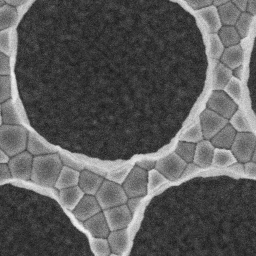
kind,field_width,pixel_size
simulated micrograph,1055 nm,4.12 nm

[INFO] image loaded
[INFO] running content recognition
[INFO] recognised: holes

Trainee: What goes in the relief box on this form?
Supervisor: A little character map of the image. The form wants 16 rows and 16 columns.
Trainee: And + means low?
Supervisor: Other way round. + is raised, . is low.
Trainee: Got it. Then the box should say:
++.........+++++
+...........++++
+............+++
+............+++
+............++.
+............++.
+...........++++
++..........++++
+++........+++++
++++......++++++
++++++++++++++++
+++++++++++.....
...++++++.......
....+++++.......
.....+++........
......++........